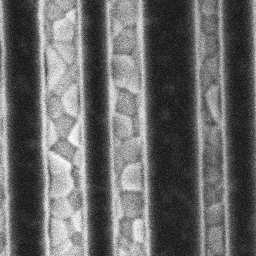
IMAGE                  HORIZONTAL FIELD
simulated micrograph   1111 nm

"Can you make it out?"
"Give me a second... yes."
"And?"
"one or a few lines or trenches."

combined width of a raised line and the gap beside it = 320 nm